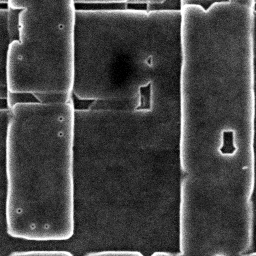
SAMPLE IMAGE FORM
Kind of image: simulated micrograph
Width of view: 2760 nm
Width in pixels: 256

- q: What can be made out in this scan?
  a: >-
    wiring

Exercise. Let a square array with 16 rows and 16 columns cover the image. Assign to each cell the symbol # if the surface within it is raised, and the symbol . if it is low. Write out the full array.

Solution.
.####.......####
.####......#####
.####......#####
.####......#####
#####......#####
.###.......#####
.###.......#####
.####......#####
#####......###.#
#####......#####
####.......#####
.####......#####
#####......#####
#####......#####
.###.......#####
...........#####